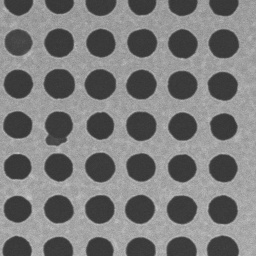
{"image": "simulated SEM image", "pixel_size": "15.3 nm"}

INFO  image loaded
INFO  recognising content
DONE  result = a regular array of holes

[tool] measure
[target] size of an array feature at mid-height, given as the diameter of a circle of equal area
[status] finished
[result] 449 nm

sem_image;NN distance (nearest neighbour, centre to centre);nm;625